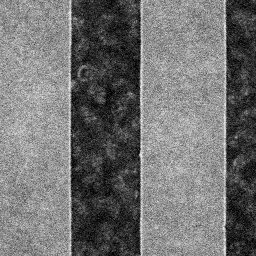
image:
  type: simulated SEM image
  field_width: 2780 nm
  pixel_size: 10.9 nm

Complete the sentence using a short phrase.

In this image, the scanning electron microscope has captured one or a few lines or trenches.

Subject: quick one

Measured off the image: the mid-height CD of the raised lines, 0.911 µm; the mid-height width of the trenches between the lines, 0.769 µm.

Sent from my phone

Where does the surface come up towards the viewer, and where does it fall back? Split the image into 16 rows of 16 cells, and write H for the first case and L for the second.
HHHHLLLLLHHHHHLL
HHHHLLLLLHHHHHLL
HHHHLLLLLHHHHHLL
HHHHLLLLLHHHHHLL
HHHHLLLLLHHHHHLL
HHHHLLLLLHHHHHLL
HHHHLLLLLHHHHHLL
HHHHLLLLLHHHHHLL
HHHHLLLLLHHHHHLL
HHHHLLLLLHHHHHLL
HHHHLLLLLHHHHHLL
HHHHLLLLLHHHHHLL
HHHHLLLLLHHHHHLL
HHHHLLLLLHHHHHLL
HHHHLLLLLHHHHHLL
HHHHLLLLLHHHHHLL